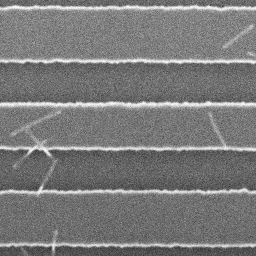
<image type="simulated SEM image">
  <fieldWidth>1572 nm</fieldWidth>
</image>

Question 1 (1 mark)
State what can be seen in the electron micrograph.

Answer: lines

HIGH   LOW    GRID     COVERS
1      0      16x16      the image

1111111111111111
1111111111111111
1111111111111111
1111111111111111
0000000000000000
0000000000000000
1111111111111111
1111111111111111
1111111111111111
0000000000000000
0000000000000000
0000000000000000
1111111111111111
1111111111111111
1111111111111111
0000000000000000